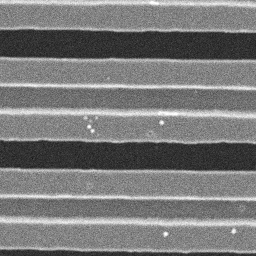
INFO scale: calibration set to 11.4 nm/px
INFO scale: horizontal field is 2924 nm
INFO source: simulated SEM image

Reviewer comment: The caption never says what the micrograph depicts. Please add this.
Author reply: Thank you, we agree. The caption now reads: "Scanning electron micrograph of lines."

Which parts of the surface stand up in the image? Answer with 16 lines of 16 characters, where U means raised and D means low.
UUUUUUUUUUUUUUUU
UUUUUUUUUUUUUUUU
DDDDDDDDDDDDDDDD
DDDDDDDDDDDDDDDD
UUUUUUUUUUUUUUUU
UUUUUUUUUUUUUUUU
UUUUUUUUUUUUUUUU
UUUUUUUUUUUUUUUU
UUUUUUUUUUUUUUUU
DDDDDDDDDDDDDDDD
DDDDDDDDDDDDDDDD
UUUUUUUUUUUUUUUU
UUUUUUUUUUUUUUUU
UUUUUUUUUUUUUUUU
UUUUUUUUUUUUUUUU
UUUUUUUUUUUUUUUU